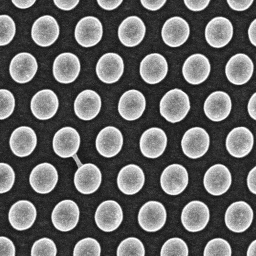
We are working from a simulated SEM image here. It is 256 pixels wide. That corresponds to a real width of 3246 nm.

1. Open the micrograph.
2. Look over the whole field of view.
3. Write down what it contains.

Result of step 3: a regular array of raised bodies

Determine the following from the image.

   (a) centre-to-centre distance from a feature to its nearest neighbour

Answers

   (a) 0.538 µm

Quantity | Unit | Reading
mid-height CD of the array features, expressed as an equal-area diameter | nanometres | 364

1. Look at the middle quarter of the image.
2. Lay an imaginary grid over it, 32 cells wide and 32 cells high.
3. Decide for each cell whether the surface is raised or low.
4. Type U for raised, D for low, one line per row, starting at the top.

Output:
UUUUDDDDUUUUUUUDDDDUUUUUUUDDDDUU
UUUUDDDDUUUUUUUDDDDUUUUUUUDDDDUU
UUUUDDDDUUUUUUDDDDDUUUUUUDDDDDUU
UUUDDDDDDUUUUUDDDDDDUUUUUDDDDDUU
UUDDDDDDDDUUUDDDDDDDDUUDDDDDDDDU
DDDDDDDDDDDDDDDDDDDDDDDDDDDDDDDD
DDDDDDDDDDDDDDDDDDDDDDDDDDDUUDDD
DDDDUUUUDDDDDDDUUUUDDDDDDUUUUUDD
DDDUUUUUUDDDDDUUUUUUDDDDDUUUUUUD
DDDUUUUUUDDDDDUUUUUUDDDDUUUUUUUD
DDDUUUUUUDDDDDUUUUUUDDDDUUUUUUUD
DDDUUUUUUDDDDDUUUUUUDDDDUUUUUUUD
DDDUUUUUDDDDDDUUUUUDDDDDUUUUUUUD
DDDDUUUDDDDDDDDUUUDDDDDDDUUUUUDD
DDDDDDDDDDDDDDDDDDDDDDDDDDDUDDDD
DDDDDDDDDDDDDDDDDDDDDDDDDDDDDDDD
UUUDDDDDDDUUUDDDDDDDDUUUDDDDDDDU
UUUDDDDDDUUUUUDDDDDDUUUUUDDDDDUU
UUUUDDDDUUUUUUUDDDDUUUUUUUDDDDUU
UUUUDDDDUUUUUUUDDDDUUUUUUUDDDDUU
UUUUDDDDUUUUUUDDDDDUUUUUUDDDDDUU
UUUDDDDDUUUUUUDDDDDUUUUUUDDDDDUU
UUUDDDDDDUUUUDDDDDDDUUUUDDDDDDUU
DDUDDDDDDDDDDDDDDDDDDDDDDDDDDDDD
DDDUDDDDDDDDDDDDDDDDDDDDDDDDDDDD
DDDDUUUUDDDDDDDDUUDDDDDDDDUUUDDD
DDDDUUUUUDDDDDUUUUUDDDDDDUUUUUUD
DDDUUUUUUDDDDDUUUUUUDDDDDUUUUUUD
DDDUUUUUUDDDDDUUUUUUDDDDUUUUUUUD
DDDUUUUUUDDDDDUUUUUUDDDDUUUUUUUD
DDDUUUUUUDDDDUUUUUUDDDDDUUUUUUDD
DDDUUUUUDDDDDDUUUUUDDDDDDUUUUUDD